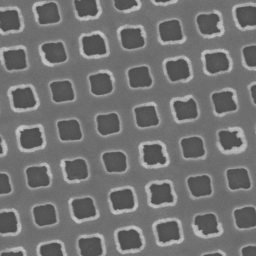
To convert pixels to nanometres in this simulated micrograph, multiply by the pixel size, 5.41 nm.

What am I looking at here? a regular array of holes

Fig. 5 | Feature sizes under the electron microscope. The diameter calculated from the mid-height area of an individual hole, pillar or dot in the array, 128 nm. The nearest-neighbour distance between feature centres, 210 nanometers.